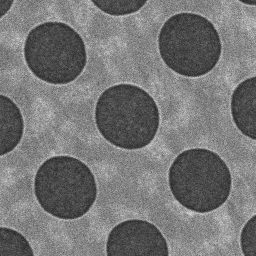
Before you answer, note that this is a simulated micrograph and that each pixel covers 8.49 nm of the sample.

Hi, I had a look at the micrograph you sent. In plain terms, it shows holes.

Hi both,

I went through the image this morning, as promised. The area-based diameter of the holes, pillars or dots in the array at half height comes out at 63.7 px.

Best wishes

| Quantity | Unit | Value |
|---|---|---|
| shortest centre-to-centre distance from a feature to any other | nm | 810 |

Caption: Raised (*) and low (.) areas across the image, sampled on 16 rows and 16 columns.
.*****...*******
***.******...***
**...*****....**
**...*****....**
**...******..***
*******..******.
.*****....****..
.*****....*****.
.*****....*****.
.**********..***
**....*****...**
**....*****...**
**....*****...**
***..***********
.******...*****.
..*****...*****.